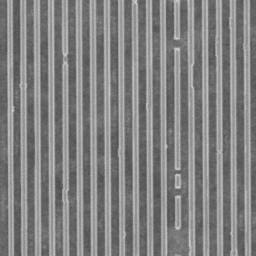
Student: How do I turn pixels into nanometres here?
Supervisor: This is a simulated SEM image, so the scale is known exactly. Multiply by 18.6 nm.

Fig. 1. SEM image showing parallel lines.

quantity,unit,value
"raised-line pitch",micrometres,0.26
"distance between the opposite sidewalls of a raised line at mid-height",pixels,4.88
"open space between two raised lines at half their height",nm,165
